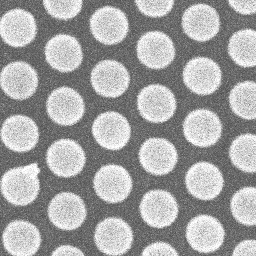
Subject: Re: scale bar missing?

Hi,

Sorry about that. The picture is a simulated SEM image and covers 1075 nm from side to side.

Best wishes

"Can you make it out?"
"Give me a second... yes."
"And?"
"a regular array of raised bodies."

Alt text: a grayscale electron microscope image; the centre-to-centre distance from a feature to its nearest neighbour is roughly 221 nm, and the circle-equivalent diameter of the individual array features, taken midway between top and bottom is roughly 155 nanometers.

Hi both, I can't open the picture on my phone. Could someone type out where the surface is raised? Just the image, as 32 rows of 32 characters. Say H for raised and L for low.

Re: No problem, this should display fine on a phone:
LLLLLLHHHHLLLLLLLHHHHLLLLLLLLHHH
LHHLLLHHHHLLHHHLLLHHHLLHHHHLLLHH
HHHHLLLLLLLHHHHHLLLLLLLHHHHLLLLL
HHHHLLLLLLLHHHHHLLLLLLLHHHHLLLLL
HHHHLLLHHLLLHHHHLLHHHLLLHHHLLHHH
LHHLLLHHHHLLLLLLLHHHHHLLLLLLLHHH
LLLLLLHHHHLLLLLLLHHHHHLLLLLLLHHH
LLLLLLHHHHLLLLLLLLHHHLLLHHLLLHHH
LHHHLLLHHLLLHHHHLLLHLLLHHHHLLLLL
HHHHHLLLLLLHHHHHLLLLLLLHHHHHLLLL
HHHHHLLLLLLLHHHHLLLLLLLHHHHLLLHH
LHHHLLLHHLLLHHHLLLHHHLLLHHLLLHHH
LLLLLLHHHHLLLLLLLHHHHHLLLLLLLHHH
LLLLLLHHHHLLLLLLLHHHHHLLLLLLLHHH
LLLLLLHHHHLLHHHLLLHHHLLLHHHLLLHH
LHHHLLLLHLLLHHHHLLLLLLLHHHHLLLLL
HHHHHLLLLLLLHHHHLLLLLLLHHHHHLLLL
HHHHHLLLLLLLHHHHLLLHHLLLHHHLLHHH
LHHHLLHHHHLLLLHLLLHHHHLLLLLLLHHH
LLLLLLHHHHLLLLLLLLHHHHLLLLLLLHHH
LLLLLLHHHHLLLLLLLLHHHHLLLHLLLHHH
LHHHHLLHHHLLHHHHLLLHHLLLHHHLLLLL
HHHHHLLLLLLLHHHHLLLLLLLHHHHHLLLL
HHHHHLLLLLLLHHHHLLLLLLLLHHHHLLLL
LHHHLLLHHHLLHHHHLLHHHLLLHHHLLHHH
LLHLLLHHHHLLLLLLLLHHHHLLLLLLLHHH
LLLLLLHHHHHLLLLLLLHHHHLLLLLLLHHH
LLLLLLHHHHLLLHHLLLHHHHLLHHHLLLHH
LHHHLLLLHLLLHHHHLLLLLLLHHHHHLLLL
HHHHHLLLLLLLHHHHLLLLLLLHHHHHLLLL
LHHHHLLLLLLLHHHHLLLHHLLLHHHHLLHH
LHHHLLLHHHLLLHHHLLHHHHLLLLLLLHHH